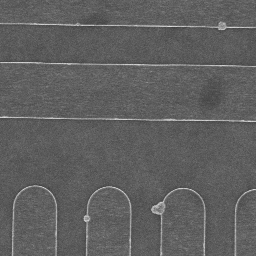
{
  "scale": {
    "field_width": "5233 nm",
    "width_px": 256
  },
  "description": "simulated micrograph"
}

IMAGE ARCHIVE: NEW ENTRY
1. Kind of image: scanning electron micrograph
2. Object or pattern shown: groups of lines, slits or small figures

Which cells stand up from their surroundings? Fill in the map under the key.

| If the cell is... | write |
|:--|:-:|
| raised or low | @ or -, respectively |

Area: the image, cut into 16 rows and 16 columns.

@@@@@@@@@@@@@@@@
---@@@@@@@@@@@@@
----------------
----------------
@@@@@@@@@@@@@@@@
@@@@@@@@@@@@@@@@
@@@@@@@@@@@@@@@@
-------------@@@
----------------
----------------
----------------
----------------
-@@---@@--@@@--@
-@@--@@@--@@@--@
-@@--@@@--@@@--@
-@@--@@@--@@@--@